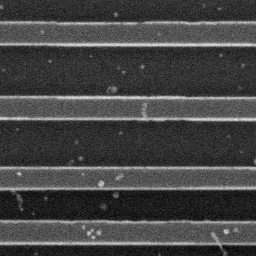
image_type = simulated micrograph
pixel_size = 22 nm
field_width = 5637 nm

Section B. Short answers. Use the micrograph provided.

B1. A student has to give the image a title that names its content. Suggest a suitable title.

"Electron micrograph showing lines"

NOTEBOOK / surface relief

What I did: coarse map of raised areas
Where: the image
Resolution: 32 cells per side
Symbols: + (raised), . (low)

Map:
................................
................................
................................
++++++++++++++++++++++++++++++++
++++++++++++++++++++++++++++++++
++++++++++++++++++++++++++++++++
................................
................................
................................
................................
................................
................................
++++++++++++++++++++++++++++++++
++++++++++++++++++++++++++++++++
++++++++++++++++++++++++++++++++
................................
................................
................................
................................
................................
................................
++++++++++++++++++++++++++++++++
++++++++++++++++++++++++++++++++
++++++++++++++++++++++++++++++++
................................
................................
................................
................................
++++++++++++++++++++++++++++++++
++++++++++++++++++++++++++++++++
........................++++++++
................................